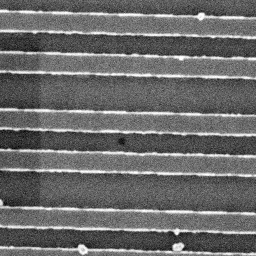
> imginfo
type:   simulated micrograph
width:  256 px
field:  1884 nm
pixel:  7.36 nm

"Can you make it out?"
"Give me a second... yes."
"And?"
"lines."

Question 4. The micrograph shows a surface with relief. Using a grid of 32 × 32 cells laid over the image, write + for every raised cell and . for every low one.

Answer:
................................
+++++...........................
++++++++++++++++++++++++++++++++
++++++++++++++++++++++++++++++++
........................++++++++
................................
................................
++++++++++++++++++++++++++++++++
++++++++++++++++++++++++++++++++
....................++++++++++++
................................
................................
................................
................................
++++++++++++++++++++++++++++++++
++++++++++++++++++++++++++++++++
...............+.+++++++++++++++
................................
................................
++++++++++++++++++++++++++++....
++++++++++++++++++++++++++++++++
...........+++++++++++++++++++++
................................
................................
................................
................................
+++++++++++++++++++++++.........
++++++++++++++++++++++++++++++++
.....+..++++++++++++++++++++++++
................................
................................
+++++++++++++++++++++++.........